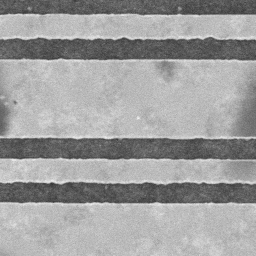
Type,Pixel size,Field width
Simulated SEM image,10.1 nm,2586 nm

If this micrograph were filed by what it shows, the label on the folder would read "lines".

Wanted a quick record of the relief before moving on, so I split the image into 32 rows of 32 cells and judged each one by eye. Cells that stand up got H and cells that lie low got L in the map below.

LLLLLLLLLLLLLLLLLLLLLLLLLLLLLLLL
LLLLLLLLLLLLLLLLLLLLLLLLLLLLLLLL
HHHHHHHHHHHHHHHHHHHHHHHHHHHHHHHH
HHHHHHHHHHHHHHHHHHHHHHHHHHHHHHHH
HHHHHHHHHHHHHHHHHHHHHHHHHHHHHHHH
LLLLLLLLLLLLLLLLLLLLLLLLLLLLLLLL
LLLLLLLLLLLLLLLLLLLLLLLLLLLLLLLL
LLLLLLLHLLLLLLLLLLLLLLLLLLLLLLLL
HHHHHHHHHHHHHHHHHHHHHHHHHHHHHHHH
HHHHHHHHHHHHHHHHHHHHHHHHHHHHHHHH
HHHHHHHHHHHHHHHHHHHHHHHHHHHHHHHH
HHHHHHHHHHHHHHHHHHHHHHHHHHHHHHHH
HHHHHHHHHHHHHHHHHHHHHHHHHHHHHHHH
HHHHHHHHHHHHHHHHHHHHHHHHHHHHHHHH
HHHHHHHHHHHHHHHHHHHHHHHHHHHHHHHH
HHHHHHHHHHHHHHHHHHHHHHHHHHHHHHHH
HHHHHHHHHHHHHHHHHHHHHHHHHHHHHHHH
LLLLLLLLLLLLLLLLLLLLLLLLLLLLLLLL
LLLLLLLLLLLLLLLLLLLLLLLLLLLLLLLL
LLLLLLLLLLLLLLLLLLLLLLLLLLLLLLLL
HHHHHHHHHHHHHHHHHHHHHHHHHHHHHHHH
HHHHHHHHHHHHHHHHHHHHHHHHHHHHHHHH
HHHHHHHHHHHHHHHHHHHHHHHHHHHHHHHH
LLLLLLLLLLLLLLLLLLLLLLLLLLLLLLLL
LLLLLLLLLLLLLLLLLLLLLLLLLLLLLLLL
HHHHHHHHHHHHHHHHHHHHHHHHHHHHHHHH
HHHHHHHHHHHHHHHHHHHHHHHHHHHHHHHH
HHHHHHHHHHHHHHHHHHHHHHHHHHHHHHHH
HHHHHHHHHHHHHHHHHHHHHHHHHHHHHHHH
HHHHHHHHHHHHHHHHHHHHHHHHHHHHHHHH
HHHHHHHHHHHHHHHHHHHHHHHHHHHHHHHH
HHHHHHHHHHHHHHHHHHHHHHHHHHHHHHHH